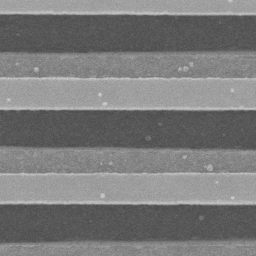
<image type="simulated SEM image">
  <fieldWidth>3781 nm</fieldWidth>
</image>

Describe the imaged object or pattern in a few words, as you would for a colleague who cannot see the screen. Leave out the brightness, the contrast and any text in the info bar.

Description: lines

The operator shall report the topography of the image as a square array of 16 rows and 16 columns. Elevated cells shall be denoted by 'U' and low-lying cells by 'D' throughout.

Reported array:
UUUUUUUUUUUUUUUU
DDDDDDDDDDDDDDDD
DDDDDDDDDDDDDDDD
DDDDDDDDDDDDDDDD
UUUUUUUUUUUUUUUU
UUUUUUUUUUUUUUUU
UUUUUUUUUUUUUUUU
DDDDDDDDDDDDDDDD
DDDDDDDDDDDDDDDD
UUUUUUUUUUUUDDDD
UUUUUUUUUUUUUUUU
UUUUUUUUUUUUUUUU
UUUUUUUUUUUUUUUU
DDDDDDDDDDDDDDDD
DDDDDDDDDDDDDDDD
UUUUUUUUUUUUUUUU